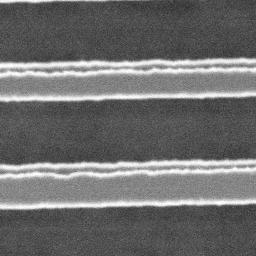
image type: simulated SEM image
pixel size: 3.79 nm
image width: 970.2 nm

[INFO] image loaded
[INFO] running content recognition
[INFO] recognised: lines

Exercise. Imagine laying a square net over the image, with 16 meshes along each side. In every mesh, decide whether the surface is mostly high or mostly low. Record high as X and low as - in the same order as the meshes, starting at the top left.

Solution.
----------------
----------------
----------------
----------------
XXXXXXXXXXXXXXXX
XXXXXXXXXXXXXXXX
----------------
----------------
----------------
----------------
XXXXXXXXXXXXXXXX
XXXXXXXXXXXXXXXX
XXXXXXXXXXXXXXXX
----------------
----------------
----------------